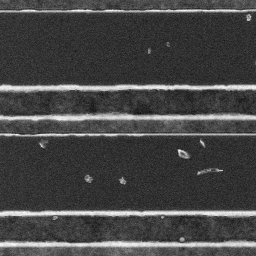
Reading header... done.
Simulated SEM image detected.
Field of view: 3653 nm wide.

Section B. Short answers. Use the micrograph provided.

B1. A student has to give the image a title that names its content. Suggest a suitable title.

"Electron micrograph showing lines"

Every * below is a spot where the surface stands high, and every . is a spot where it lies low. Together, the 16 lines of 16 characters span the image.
................
****************
****************
****************
****************
................
................
................
****************
****************
****************
****************
****************
................
................
................